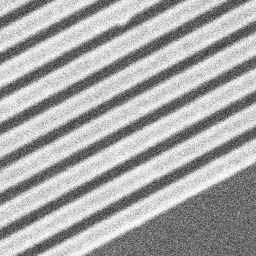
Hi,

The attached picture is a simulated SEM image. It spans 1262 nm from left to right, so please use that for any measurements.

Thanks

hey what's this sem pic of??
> parallel lines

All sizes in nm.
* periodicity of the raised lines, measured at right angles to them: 152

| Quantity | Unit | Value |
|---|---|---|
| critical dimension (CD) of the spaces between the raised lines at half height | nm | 65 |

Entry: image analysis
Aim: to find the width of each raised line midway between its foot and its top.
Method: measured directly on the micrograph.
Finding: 17.7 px